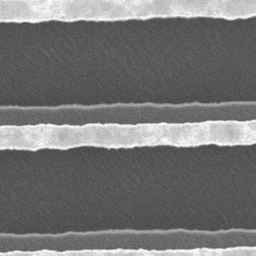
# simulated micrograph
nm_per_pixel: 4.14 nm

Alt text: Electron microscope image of lines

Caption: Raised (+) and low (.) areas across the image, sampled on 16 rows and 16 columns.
++++++++++++++++
................
................
................
................
................
.........+..++++
++++++++++++++++
++++++++++++++++
................
................
................
................
................
......++++++++++
++++++++++++++++